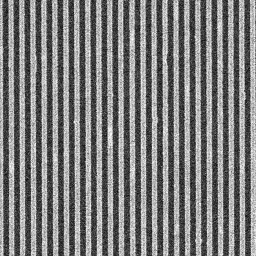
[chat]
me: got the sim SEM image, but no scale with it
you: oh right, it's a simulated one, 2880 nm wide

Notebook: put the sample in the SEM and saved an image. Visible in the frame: parallel lines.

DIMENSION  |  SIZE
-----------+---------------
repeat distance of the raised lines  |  11 pixels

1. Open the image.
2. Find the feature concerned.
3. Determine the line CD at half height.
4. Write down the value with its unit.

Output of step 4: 47.8 nm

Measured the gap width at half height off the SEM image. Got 77.3 nm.